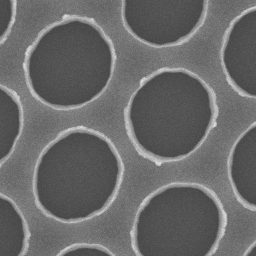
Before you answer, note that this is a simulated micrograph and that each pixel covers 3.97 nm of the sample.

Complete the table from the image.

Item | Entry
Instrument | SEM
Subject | holes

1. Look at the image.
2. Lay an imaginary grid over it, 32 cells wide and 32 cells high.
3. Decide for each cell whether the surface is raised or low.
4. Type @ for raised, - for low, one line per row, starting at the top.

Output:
--@@@@@@@@@@@@@-----------@@@@@@
--@@@@@@@@@@@@@----------@@@@@@-
-@@@@@@@@-@@@@@@---------@@@@@--
-@@@@@------@@@@--------@@@@@---
@@@@@--------@@@@------@@@@@@---
@@@@@---------@@@@@---@@@@@@----
@@@@----------@@@@@@@@@@@@@@----
@@@@----------@@@@@@@@@@@@@@----
@@@@----------@@@@@@@@@@@@@@----
@@@@----------@@@@@-----@@@@@---
@@@@---------@@@@@-------@@@@---
-@@@---------@@@@---------@@@@--
--@@@------@@@@@----------@@@@@@
--@@@@@@@@@@@@@@-----------@@@@@
---@@@@@@@@@@@@@-----------@@@@@
---@@@@@@@@@@@@@----------@@@@@@
--@@@@@@@--@@@@@@---------@@@@@-
--@@@@@------@@@@--------@@@@@--
--@@@@--------@@@@------@@@@@---
-@@@@----------@@@@----@@@@@@---
@@@@@----------@@@@@@@@@@@@@@---
@@@@@----------@@@@@@@@@@@@@@---
@@@@-----------@@@@@@@@@@@@@@---
@@@@----------@@@@@@@----@@@@---
@@@@@---------@@@@@-------@@@@--
--@@@--------@@@@@---------@@@@-
--@@@@------@@@@@-----------@@@@
---@@@@@--@@@@@@@-----------@@@@
---@@@@@@@@@@@@@@-----------@@@@
---@@@@@@@@@@@@@@----------@@@@@
---@@@@@@@@@@@@@@----------@@@@@
---@@@@@-----@@@@---------@@@@@-